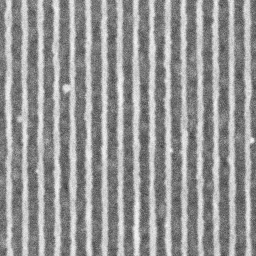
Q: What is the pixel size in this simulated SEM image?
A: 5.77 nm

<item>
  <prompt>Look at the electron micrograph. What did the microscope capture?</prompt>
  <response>parallel lines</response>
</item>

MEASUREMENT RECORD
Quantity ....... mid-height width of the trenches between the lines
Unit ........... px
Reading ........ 11.2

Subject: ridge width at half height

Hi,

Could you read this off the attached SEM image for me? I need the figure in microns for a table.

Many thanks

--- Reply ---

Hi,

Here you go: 0.0267